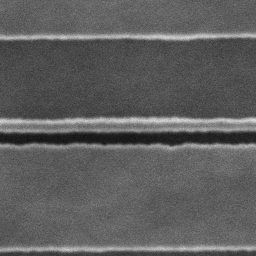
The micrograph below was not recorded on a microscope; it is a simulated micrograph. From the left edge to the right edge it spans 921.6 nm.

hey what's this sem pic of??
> lines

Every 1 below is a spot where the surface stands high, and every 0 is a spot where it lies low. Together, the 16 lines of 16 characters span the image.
1111111111111111
1111111111111111
0000000000000000
0000000000000000
0000000000000000
0000000000000000
0000000000000000
0000000000000000
0000000000000000
1111111111111111
1111111111111111
1111111111111111
1111111111111111
1111111111111111
1111111111111111
1111111111111111